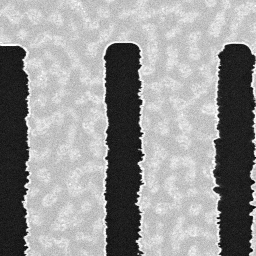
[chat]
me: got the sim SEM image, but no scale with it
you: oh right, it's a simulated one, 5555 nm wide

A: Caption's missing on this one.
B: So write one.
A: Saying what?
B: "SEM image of one or a few lines or trenches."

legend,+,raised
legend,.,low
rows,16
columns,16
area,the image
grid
++++++++++++++++
++++++++++++++++
++++++++++++++++
..+++++..+++++..
..+++++..+++++..
..+++++..+++++..
..+++++..+++++..
..+++++..+++++..
..+++++..+++++..
..+++++..++++...
..+++++..++++...
..+++++..++++...
..+++++..+++++..
..+++++..+++++..
..+++++..+++++..
..+++++..+++++..